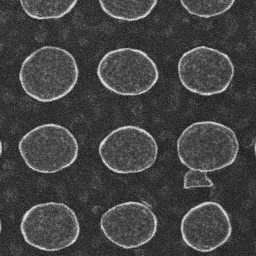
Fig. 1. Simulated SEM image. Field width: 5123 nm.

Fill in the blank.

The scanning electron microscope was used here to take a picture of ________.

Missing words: a regular array of raised bodies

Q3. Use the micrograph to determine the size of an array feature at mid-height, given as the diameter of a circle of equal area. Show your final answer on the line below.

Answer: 1030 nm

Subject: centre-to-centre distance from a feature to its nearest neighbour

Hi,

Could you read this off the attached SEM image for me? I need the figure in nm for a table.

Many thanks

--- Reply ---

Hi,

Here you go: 1520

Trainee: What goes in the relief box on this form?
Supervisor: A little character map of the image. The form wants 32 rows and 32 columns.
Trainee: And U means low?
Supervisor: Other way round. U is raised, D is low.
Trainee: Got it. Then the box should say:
DDDUUUUUUDDDDUUUUUUDDDDUUUUUUDDD
DDDUUUUUDDDDDUUUUUUDDDDDUUUUDDDD
DDDDDDDDDDDDDDDDDDDDDDDDDDDDDDDD
DDDDDDDDDDDDDDDDDDDDDDDDDDDDDDDD
DDDDDDDDDDDDDDDDDDDDDDDDDDDDDDDD
DDDDDDDDDDDDDDDDDDDDDDDDDDDDDDDD
DDDDUUUUDDDDDDUUUUDDDDDDUUUDDDDD
DDDUUUUUUDDDDUUUUUUDDDDUUUUUUDDD
DDDUUUUUUUDDUUUUUUUDDDUUUUUUUDDD
DDDUUUUUUUDDUUUUUUUUDDUUUUUUUDDD
DDDUUUUUUDDDDUUUUUUDDDDUUUUUUDDD
DDDUUUUUDDDDDDUUUUDDDDDDUUUDDDDD
DDDDDUDDDDDDDDDDDDDDDDDDDDDDDDDD
DDDDDDDDDDDDDDDDDDDDDDDDDDDDDDDD
DDDDDDDDDDDDDDDDDDDDDDDDDDDDDDDD
DDDDDDDDDDDDDDDDDDDDDDDDUUUDDDDD
DDDDUUUUUDDDDDUUUUDDDDDUUUUUUDDD
DDDUUUUUUDDDDUUUUUUDDDUUUUUUUUDD
DDUUUUUUUUDDDUUUUUUUDDUUUUUUUUDD
DDDUUUUUUDDDDUUUUUUDDDUUUUUUUDDD
DDDUUUUUUDDDDUUUUUUDDDDUUUUUUDDD
DDDDDUUDDDDDDDDUUDDDDDDDDDDDDDDD
DDDDDDDDDDDDDDDDDDDDDDDDDDDDDDDD
DDDDDDDDDDDDDDDDDDDDDDDDDDDDDDDD
DDDDDDDDDDDDDDDDDDDDDDDDDDDDDDDD
DDDDDDUDDDDDDDDDUDDDDDDDDUUDDDDD
DDDDUUUUUDDDDUUUUUUDDDDDUUUUDDDD
DDDUUUUUUUDDDUUUUUUDDDDUUUUUUDDD
DDDUUUUUUUDDDUUUUUUDDDDUUUUUUDDD
DDDUUUUUUUDDDUUUUUUDDDDUUUUUUDDD
DDDDUUUUUDDDDDDUUUDDDDDDUUUUDDDD
DDDDDDDDDDDDDDDDDDDDDDDDDDDDDDDD